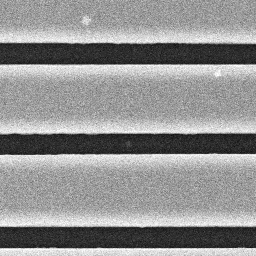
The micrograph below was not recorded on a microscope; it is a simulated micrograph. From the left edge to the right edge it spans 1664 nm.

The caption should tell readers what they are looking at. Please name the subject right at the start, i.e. lines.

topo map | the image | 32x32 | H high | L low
HHHHHHHHHHHHHHHHHHHHHHHHHHHHHHHH
HHHHHHHHHHHHHHHHHHHHHHHHHHHHHHHH
HHHHHHHHHHHHHHHHHHHHHHHHHHHHHHHH
HHHHHHHHHHHHHHHHHHHHHHHHHHHHHHHH
HHHHHHHHHHHHHHHHHHHHHHHHHHHHHHHH
LLLLLLLLLLLLLLLLLLLLLLLLLLLLLLLL
LLLLLLLLLLLLLLLLLLLLLLLLLLLLLLLL
LLLLLLLLLLLLLLLLLLLLLLLLLLLLLLLL
HHHHHHHHHHHHHHHHHHHHHHHHHHHHHHHH
HHHHHHHHHHHHHHHHHHHHHHHHHHHHHHHH
HHHHHHHHHHHHHHHHHHHHHHHHHHHHHHHH
HHHHHHHHHHHHHHHHHHHHHHHHHHHHHHHH
HHHHHHHHHHHHHHHHHHHHHHHHHHHHHHHH
HHHHHHHHHHHHHHHHHHHHHHHHHHHHHHHH
HHHHHHHHHHHHHHHHHHHHHHHHHHHHHHHH
HHHHHHHHHHHHHHHHHHHHHHHHHHHHHHHH
HHHHHHHHHHHHHHHHHHHHHHHHHHHHHHHH
LLLLLLLLLLLLLLLLLLLLLLLLLLLLLLLL
LLLLLLLLLLLLLLLLLLLLLLLLLLLLLLLL
HHHHHHHHHHHHHHHHHHHHHHHHHHHHHHHH
HHHHHHHHHHHHHHHHHHHHHHHHHHHHHHHH
HHHHHHHHHHHHHHHHHHHHHHHHHHHHHHHH
HHHHHHHHHHHHHHHHHHHHHHHHHHHHHHHH
HHHHHHHHHHHHHHHHHHHHHHHHHHHHHHHH
HHHHHHHHHHHHHHHHHHHHHHHHHHHHHHHH
HHHHHHHHHHHHHHHHHHHHHHHHHHHHHHHH
HHHHHHHHHHHHHHHHHHHHHHHHHHHHHHHH
HHHHHHHHHHHHHHHHHHHHHHHHHHHHHHHH
LLLLLLLLLLLLLLLLLLLLLLLLLLLLLLLL
LLLLLLLLLLLLLLLLLLLLLLLLLLLLLLLL
LLLLLLLLLLLLLLLLLLLLLLLLLLLLLLLL
HHHHHHHHHHHHHHHHHHHHHHHHHHHHHHHH